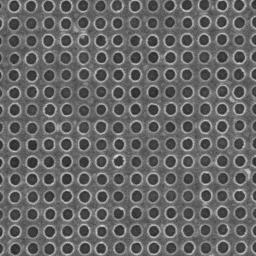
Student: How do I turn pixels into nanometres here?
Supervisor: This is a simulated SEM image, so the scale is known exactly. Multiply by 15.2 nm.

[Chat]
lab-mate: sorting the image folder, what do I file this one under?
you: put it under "a regular array of holes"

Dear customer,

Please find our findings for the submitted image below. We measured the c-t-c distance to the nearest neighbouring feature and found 255 nanometers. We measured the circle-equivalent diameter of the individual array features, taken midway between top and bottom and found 168 nm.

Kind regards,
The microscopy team